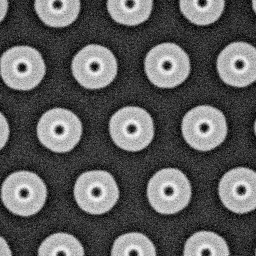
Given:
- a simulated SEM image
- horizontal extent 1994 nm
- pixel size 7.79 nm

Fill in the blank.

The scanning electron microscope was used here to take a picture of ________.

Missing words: an array of small figures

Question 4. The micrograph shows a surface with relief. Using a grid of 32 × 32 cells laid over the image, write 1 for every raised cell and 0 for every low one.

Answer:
10001111110001111110000111110000
10000111110000111110000111110000
00000111100000111100000011100000
00000000000000000000000000000000
00000000000000000000000000000000
00000000000000000000110000000110
01111000001111000001111000001111
11111000011111000011111100011111
11111100011111100011111100011111
11111000011111000011111000001111
01111000001111000001110000000110
00000000000000000000000000000000
00000000000000000000000000000000
00000000000000001000000011100000
00000111100000111110000111110000
10000111110000111110000111110000
10000111110000111110000111110000
10000111110000111110000111110000
00000011100000011100000011100000
00000000000000000000000000000000
00000000000000000000000000000000
00110000000110000000111000000111
01111000001111000001111000001111
11111100011111100011111100011111
11111100011111100011111100011111
01111000001111000001111000001111
00111000000110000000110000000110
00000000000000000000000000000000
00000000000000000000000000000000
00000011100000011100000011100000
10000111110000111110000111110000
10000111110000111110000111111000